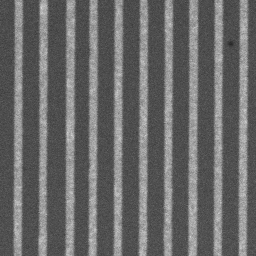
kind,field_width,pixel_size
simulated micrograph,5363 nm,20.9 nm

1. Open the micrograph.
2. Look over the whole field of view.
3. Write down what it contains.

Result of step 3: parallel lines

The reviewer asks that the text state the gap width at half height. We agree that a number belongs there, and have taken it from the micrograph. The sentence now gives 372 nm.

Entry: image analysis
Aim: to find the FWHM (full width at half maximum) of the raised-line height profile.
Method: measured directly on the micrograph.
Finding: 154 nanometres